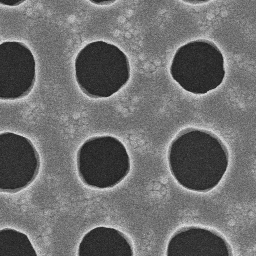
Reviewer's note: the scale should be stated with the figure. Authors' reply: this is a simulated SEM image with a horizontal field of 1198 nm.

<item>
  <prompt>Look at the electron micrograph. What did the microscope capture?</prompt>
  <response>holes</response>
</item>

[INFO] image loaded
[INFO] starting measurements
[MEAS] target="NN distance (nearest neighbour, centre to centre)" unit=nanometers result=434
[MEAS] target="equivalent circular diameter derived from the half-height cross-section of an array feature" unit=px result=54.2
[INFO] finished